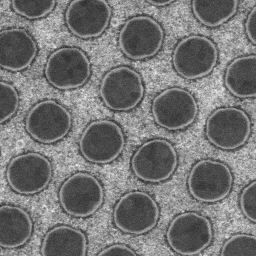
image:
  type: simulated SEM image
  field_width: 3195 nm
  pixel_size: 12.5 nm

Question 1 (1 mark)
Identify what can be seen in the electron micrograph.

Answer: a regular array of raised bodies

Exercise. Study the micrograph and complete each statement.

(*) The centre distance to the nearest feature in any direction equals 55.6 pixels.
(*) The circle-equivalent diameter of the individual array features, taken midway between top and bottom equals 514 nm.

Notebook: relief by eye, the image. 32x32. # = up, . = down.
..#####..####...........#####...
..####..######..........#####...
........#####...###......###...#
.........####...####...........#
####......#....#####...........#
####...........#####...###......
####...###......###...#####.....
####..#####...........#####...##
.##...#####...........####...###
......#####..####......##...####
#......###...#####..........####
##...........#####...##......###
##...........####..#####........
##..####......##...#####........
#...#####..........#####..#####.
...######...##......###...#####.
....####...####...........#####.
.....##...#####...........#####.
..........#####...###.......#...
...##......###...#####..........
.#####...........#####...###....
.#####...........####...#####...
.#####...###......##....#####...
..###...#####...........#####..#
........#####...###.....####..##
........####...####...........##
###......##...######...........#
####..........######..####......
####...##......####..#####......
####..####...........#####....#.
###...#####..........#####..####
.....######..####.....###...####